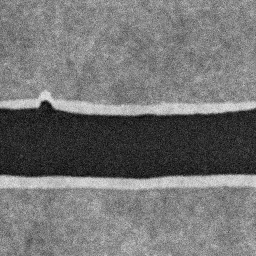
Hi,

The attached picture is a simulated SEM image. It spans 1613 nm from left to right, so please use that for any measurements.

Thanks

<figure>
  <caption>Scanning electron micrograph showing one or a few lines or trenches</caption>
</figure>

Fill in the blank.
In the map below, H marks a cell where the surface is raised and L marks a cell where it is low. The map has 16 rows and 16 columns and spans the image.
HHHHHHHHHHHHHHHH
HHHHHHHHHHHHHHHH
HHHHHHHHHHHHHHHH
HHHHHHHHHHHHHHHH
HHHHHHHHHHHHHHHH
HHHHHHHHHHHHHHHH
LLLLHHHHHHHHHHHH
LLLLLLLLLLLLLLLL
LLLLLLLLLLLLLLLL
LLLLLLLLLLLLLLLL
LLLLLLLLLLLLLLLL
HHHHHHHLLHHHHHHH
HHHHHHHHHHHHHHHH
HHHHHHHHHHHHHHHH
HHHHHHHHHHHHHHHH
HHHHHHHHHHHHHHHH